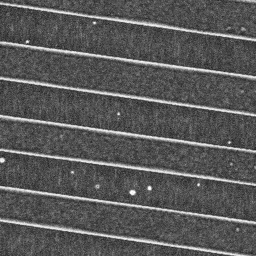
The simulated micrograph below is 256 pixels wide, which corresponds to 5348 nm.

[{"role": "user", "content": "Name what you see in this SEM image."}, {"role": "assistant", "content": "lines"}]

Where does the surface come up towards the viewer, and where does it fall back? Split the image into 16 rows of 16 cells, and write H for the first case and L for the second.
LLHHHHHHHHHHHHHH
LLLLLLLLLHHHHHHH
LLLLLLLLLLLLLLLL
HHHHHHLLLLLLLLLL
HHHHHHHHHHHHHHLL
LLLLHHHHHHHHHHHH
LLLLLLLLLLLHHHHH
HHLLLLLLLLLLLLLL
HHHHHHHHHLLLLLLL
LHHHHHHHHHHHHHHH
LLLLLLLLHHHHHHHH
LLLLLLLLLLLLLLLH
HHHHHHLLLLLLLLLL
HHHHHHHHHHHHHLLL
LLLLLHHHHHHHHHHH
LLLLLLLLLLLLHHHH